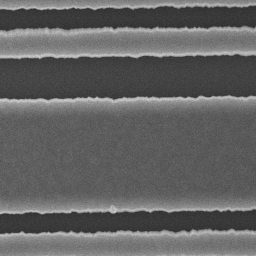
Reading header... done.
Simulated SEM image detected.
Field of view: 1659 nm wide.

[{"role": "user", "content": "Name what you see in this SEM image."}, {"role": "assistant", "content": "lines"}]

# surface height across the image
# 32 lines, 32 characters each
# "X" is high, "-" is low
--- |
XXXXXXXXXXXXXXXXXXXXXXXXXXXXXXXX
--------------------------------
--------------------------------
-------------X-X-X-XXX-XX-XXXXXX
XXXXXXXXXXXXXXXXXXXXXXXXXXXXXXXX
XXXXXXXXXXXXXXXXXXXXXXXXXXXXXXXX
XXXXXXXXXXXXXXXXXXXXXXXXXXXXXXXX
--------------------------------
--------------------------------
--------------------------------
--------------------------------
--------------------------------
XXXXXXXXXXXXXXXXXXXXXXXXXXXXXXXX
XXXXXXXXXXXXXXXXXXXXXXXXXXXXXXXX
XXXXXXXXXXXXXXXXXXXXXXXXXXXXXXXX
XXXXXXXXXXXXXXXXXXXXXXXXXXXXXXXX
XXXXXXXXXXXXXXXXXXXXXXXXXXXXXXXX
XXXXXXXXXXXXXXXXXXXXXXXXXXXXXXXX
XXXXXXXXXXXXXXXXXXXXXXXXXXXXXXXX
XXXXXXXXXXXXXXXXXXXXXXXXXXXXXXXX
XXXXXXXXXXXXXXXXXXXXXXXXXXXXXXXX
XXXXXXXXXXXXXXXXXXXXXXXXXXXXXXXX
XXXXXXXXXXXXXXXXXXXXXXXXXXXXXXXX
XXXXXXXXXXXXXXXXXXXXXXXXXXXXXXXX
XXXXXXXXXXXXXXXXXXXXXXXXXXXXXXXX
XXXXXXXXXXXXXXXXXXXXXXXXXXXXXXXX
XXXXXXXXXXXXXXX-X----X----------
--------------------------------
--------------------------------
XXXXXXXXXXXXXXXXXXXXXXXXXXXXXXXX
XXXXXXXXXXXXXXXXXXXXXXXXXXXXXXXX
XXXXXXXXXXXXXXXXXXXXXXXXXXXXXXXX